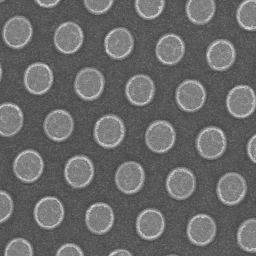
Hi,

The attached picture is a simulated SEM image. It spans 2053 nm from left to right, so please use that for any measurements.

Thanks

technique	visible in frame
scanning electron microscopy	a regular array of raised bodies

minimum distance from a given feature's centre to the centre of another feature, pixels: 50.7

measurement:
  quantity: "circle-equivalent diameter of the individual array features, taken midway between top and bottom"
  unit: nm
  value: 242